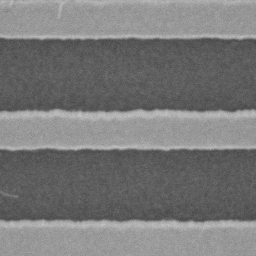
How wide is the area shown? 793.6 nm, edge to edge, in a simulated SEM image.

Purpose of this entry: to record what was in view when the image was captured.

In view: lines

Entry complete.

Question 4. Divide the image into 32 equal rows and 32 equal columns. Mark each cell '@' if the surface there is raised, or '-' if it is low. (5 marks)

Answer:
@@@@@@@@@@@@@@@@@@@@@@@@@@@@@@@@
@@@@@@@@@@@@@@@@@@@@@@@@@@@@@@@@
@@@@@@@@@@@@@@@@@@@@@@@@@@@@@@@@
@@@@@@@@@@@@@@@@@@@@@@@@@@@@@@@@
@@@@@@@@@@@@@@@@@@@@@@@@@@@@@@@@
--------------------------------
--------------------------------
--------------------------------
--------------------------------
--------------------------------
--------------------------------
--------------------------------
--------------------------------
--------------------------------
@@@@@@@@@@@@@@@@@@@@@@@@@@@@@@@@
@@@@@@@@@@@@@@@@@@@@@@@@@@@@@@@@
@@@@@@@@@@@@@@@@@@@@@@@@@@@@@@@@
@@@@@@@@@@@@@@@@@@@@@@@@@@@@@@@@
@@@@@@@@@@@@@@@@@@@@@@@@@@@@@@@@
--------------------------------
--------------------------------
--------------------------------
--------------------------------
--------------------------------
--------------------------------
--------------------------------
--------------------------------
--------------------------------
@@@@@@@@@@@@@@@@@@@@@@@@@@@@@@@@
@@@@@@@@@@@@@@@@@@@@@@@@@@@@@@@@
@@@@@@@@@@@@@@@@@@@@@@@@@@@@@@@@
@@@@@@@@@@@@@@@@@@@@@@@@@@@@@@@@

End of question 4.